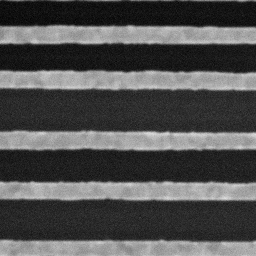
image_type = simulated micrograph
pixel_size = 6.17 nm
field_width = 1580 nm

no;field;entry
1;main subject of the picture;lines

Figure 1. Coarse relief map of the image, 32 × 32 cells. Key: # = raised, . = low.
................................
................................
................................
###########################.....
################################
................................
................................
................................
................................
################################
################################
................................
................................
................................
................................
................................
.###......##....................
################################
################################
................................
................................
................................
................................
################################
################################
................................
................................
................................
................................
................................
################################
################################